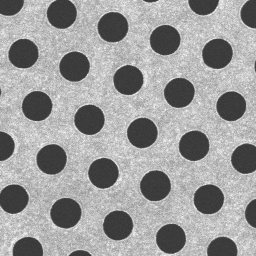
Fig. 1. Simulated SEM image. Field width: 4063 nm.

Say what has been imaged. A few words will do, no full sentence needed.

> a regular array of holes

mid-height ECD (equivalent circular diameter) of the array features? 483 nm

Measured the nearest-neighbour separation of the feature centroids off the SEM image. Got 0.85 micrometres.